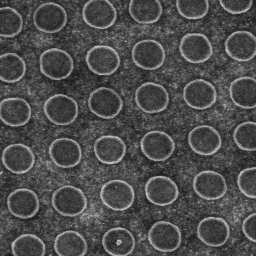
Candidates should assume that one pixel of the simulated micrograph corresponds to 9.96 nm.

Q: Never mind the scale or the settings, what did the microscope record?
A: a regular array of raised bodies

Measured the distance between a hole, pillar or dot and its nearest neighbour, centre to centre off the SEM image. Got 450 nm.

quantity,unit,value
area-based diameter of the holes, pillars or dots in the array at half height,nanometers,302